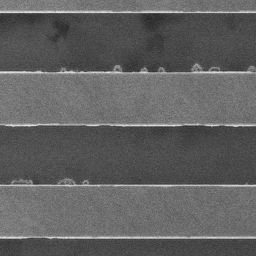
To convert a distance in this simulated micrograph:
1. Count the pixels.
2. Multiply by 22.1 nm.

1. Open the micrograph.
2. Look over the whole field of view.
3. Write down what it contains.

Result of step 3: lines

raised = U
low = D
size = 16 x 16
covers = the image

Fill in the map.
UUUUUUUUUUUUUUUU
DDDDDDDDDDDDDDDD
DDDDDDDDDDDDDDDD
DDDDDDDDDDDDDDDD
DDDDDDDDDDDDDDDD
UUUUUUUUUUUUUUUU
UUUUUUUUUUUUUUUU
UUUUUUUUUUUUUUUU
DDDDDDDDDDDDDDDD
DDDDDDDDDDDDDDDD
DDDDDDDDDDDDDDDD
DDDDDDDDDDDDDDDD
UUUUUUUUUUUUUUUU
UUUUUUUUUUUUUUUU
UUUUUUUUUUUUUUUU
DDDDDDDDDDDDDDDD